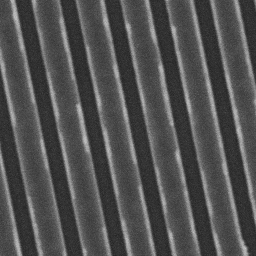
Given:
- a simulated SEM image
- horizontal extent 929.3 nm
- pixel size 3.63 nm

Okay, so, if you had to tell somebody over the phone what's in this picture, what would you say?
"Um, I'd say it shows parallel lines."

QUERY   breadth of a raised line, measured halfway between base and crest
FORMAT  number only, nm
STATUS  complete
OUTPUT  96.4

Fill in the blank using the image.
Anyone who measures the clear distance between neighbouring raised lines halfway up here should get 61.8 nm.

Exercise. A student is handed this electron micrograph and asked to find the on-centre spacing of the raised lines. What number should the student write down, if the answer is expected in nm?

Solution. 159